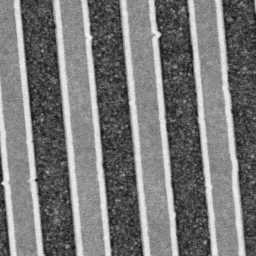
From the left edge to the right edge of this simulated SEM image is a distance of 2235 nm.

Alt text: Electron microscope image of one or a few lines or trenches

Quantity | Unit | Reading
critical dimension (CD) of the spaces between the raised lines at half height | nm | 339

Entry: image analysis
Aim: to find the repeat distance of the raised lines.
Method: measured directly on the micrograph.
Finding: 0.583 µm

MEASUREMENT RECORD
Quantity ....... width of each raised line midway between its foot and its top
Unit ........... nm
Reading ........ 243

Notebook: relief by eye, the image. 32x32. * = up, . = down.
**.....****.....***.....***.....
**.....****.....***.....***.....
**.....****.....***.....***.....
**.....****.....***.....****....
**......***.....****....****....
***.....***.....***.....****....
***.....***.....****.....***....
***.....***.....****.....***....
***.....***.....****.....***....
***.....***.....****.....***....
***.....****....****.....***....
***.....****.....***.....***....
***.....****.....***.....***....
***.....****.....***.....***....
***.....****.....***.....****...
****.....***.....***.....****...
****.....***.....***.....****...
****.....***.....****....****...
****.....***.....****.....***...
.***.....***.....****.....***...
.***.....***.....****.....***...
.***.....****....****.....***...
.***.....****.....***.....***...
.***.....****.....***.....***...
.***.....****.....***.....***...
.***.....****.....***.....****..
.****.....***.....***.....****..
.****.....***.....****.....***..
.****.....***.....****.....***..
.****.....***.....****.....***..
..***.....***.....****.....***..
..***.....****....****.....***..